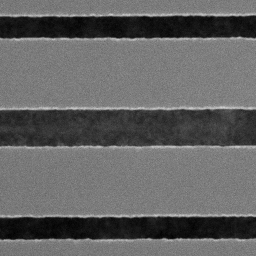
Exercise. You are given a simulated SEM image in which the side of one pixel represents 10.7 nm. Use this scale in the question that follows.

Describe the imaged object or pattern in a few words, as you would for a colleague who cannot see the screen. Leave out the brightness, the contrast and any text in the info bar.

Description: lines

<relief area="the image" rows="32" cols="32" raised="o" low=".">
oooooooooooooooooooooooooooooooo
oooooooooooooooooooooooooooooooo
................................
................................
................................
oooooooooooooooooooooooooooooooo
oooooooooooooooooooooooooooooooo
oooooooooooooooooooooooooooooooo
oooooooooooooooooooooooooooooooo
oooooooooooooooooooooooooooooooo
oooooooooooooooooooooooooooooooo
oooooooooooooooooooooooooooooooo
oooooooooooooooooooooooooooooooo
oooooooooooooooooooooooooooooooo
................................
................................
................................
................................
oooooooooooooooooooooooooooooooo
oooooooooooooooooooooooooooooooo
oooooooooooooooooooooooooooooooo
oooooooooooooooooooooooooooooooo
oooooooooooooooooooooooooooooooo
oooooooooooooooooooooooooooooooo
oooooooooooooooooooooooooooooooo
oooooooooooooooooooooooooooooooo
oooooooooooooooooooooooooooooooo
................................
................................
................................
oooooooooooooooooooooooooooooooo
oooooooooooooooooooooooooooooooo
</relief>